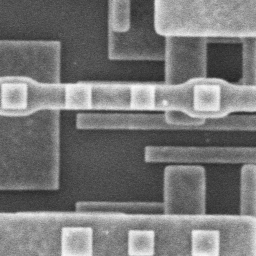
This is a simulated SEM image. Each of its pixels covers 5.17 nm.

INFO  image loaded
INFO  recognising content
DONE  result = wiring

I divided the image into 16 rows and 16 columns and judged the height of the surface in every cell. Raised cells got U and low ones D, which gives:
DDDDDDDDDDUUUUUU
DDDDDDDDDDUUUUUU
DDDDDDDDDDDDDDDD
DDDDDDDDDDDDDDDD
DDDDDDDDDDDDDDDD
UUUUUUUUUUUUUUUU
UUUUUUUUUUUUUUUU
DDDDDDDDDDDDDDDD
DDDDDDDDDDDDDDDD
DDDDDDDDDDDDDDDD
DDDDDDDDDDDDDDDD
DDDDDDDDDDDDDDDD
DDDDDDDDDDDDDDDD
UUUUUUUUUUUUUUUD
UUUUUUUUUUUUUUUU
UUUUUUUUUUUUUUUU